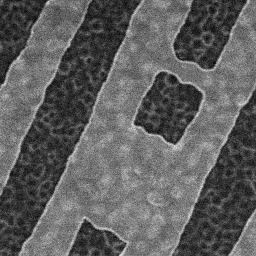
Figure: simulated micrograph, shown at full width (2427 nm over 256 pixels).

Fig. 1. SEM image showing one or a few lines or trenches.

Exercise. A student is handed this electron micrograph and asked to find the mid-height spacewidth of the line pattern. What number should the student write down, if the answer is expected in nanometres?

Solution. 466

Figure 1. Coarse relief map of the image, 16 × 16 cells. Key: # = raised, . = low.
...##....###...#
..###...###....#
..###...###...##
.###...####...##
.##....#########
###...###...####
###...###....##.
##....##....###.
##...#####.###..
#....#########..
#...#########...
....#########...
...#########....
...#########....
..###..####....#
.###....###....#